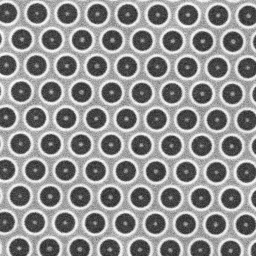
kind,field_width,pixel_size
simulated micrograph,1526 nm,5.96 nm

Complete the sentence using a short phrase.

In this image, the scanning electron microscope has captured an array of small figures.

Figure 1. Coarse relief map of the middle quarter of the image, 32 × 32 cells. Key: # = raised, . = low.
....#......##......#......##....
...###.....##.....###.....##....
...###....####....###.....###...
##############################..
###...#####.#######.############
##.....###....###.....###....###
##.....##.....###.....##......##
##.....##......##.....##......##
##.....###....###.....###....###
###...####...#####...####....###
################################
..####....####...####....####...
...###.....##.....###.....##....
...##......##.....##......##....
...##......##.....##......##....
..####....###.....###....###....
###############.######..######.#
####.######.#######.############
##....####....###....####....###
#......##.....###.....##.....###
#......##......#......##......##
##.....##.....###.....##.....###
###...####...#####...####....###
################################
..####....####...#####..#####...
...##.....###.....###....###....
...##......##.....##......##....
...##.....###.....##......##....
...###....###.....###....###....
#######.#######.######..#####...
###..###########################
##....####....###....####....###